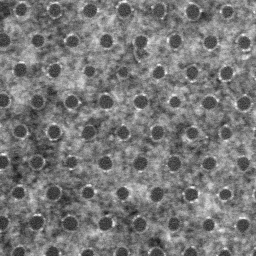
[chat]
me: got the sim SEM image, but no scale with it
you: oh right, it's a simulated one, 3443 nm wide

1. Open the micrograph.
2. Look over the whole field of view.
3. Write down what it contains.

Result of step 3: a regular array of raised bodies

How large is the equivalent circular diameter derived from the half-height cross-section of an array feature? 201 nanometers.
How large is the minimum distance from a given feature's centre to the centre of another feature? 0.451 microns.